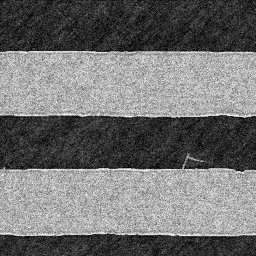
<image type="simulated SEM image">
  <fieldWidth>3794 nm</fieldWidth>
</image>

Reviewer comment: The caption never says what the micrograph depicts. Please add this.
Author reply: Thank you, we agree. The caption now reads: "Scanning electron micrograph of one or a few lines or trenches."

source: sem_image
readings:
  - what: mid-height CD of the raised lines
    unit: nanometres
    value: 943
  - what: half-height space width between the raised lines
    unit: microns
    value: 0.802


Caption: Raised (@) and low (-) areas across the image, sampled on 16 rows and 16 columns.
----------------
----------------
----------------
@@@@@@@@@@@@@@@@
@@@@@@@@@@@@@@@@
@@@@@@@@@@@@@@@@
@@@@@@@@@@@@@@@@
----------------
----------------
----------------
----------------
@@@@@@@@@@@@@@@@
@@@@@@@@@@@@@@@@
@@@@@@@@@@@@@@@@
@@@@@@@@@@@@@@@@
----------------